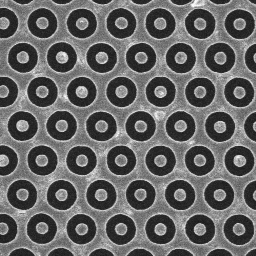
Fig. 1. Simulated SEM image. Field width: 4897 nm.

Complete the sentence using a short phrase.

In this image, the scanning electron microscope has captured a regular array of ring-shaped grooves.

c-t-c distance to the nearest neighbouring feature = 39.1 pixels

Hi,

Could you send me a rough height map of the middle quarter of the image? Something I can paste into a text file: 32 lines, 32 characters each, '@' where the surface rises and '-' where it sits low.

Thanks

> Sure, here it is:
---@@@-------@@@------@@@@------
--@@@@@-----@@@@@----@@@@@@-----
@@@@@@@@@@@@@@@@@@@@@@@@@@@@@@@@
@@@---@@@@@@@---@@@@@@----@@@@@@
@@-----@@@@------@@@@------@@@@-
@-------@@@---@---@@@-------@@@-
@--@@@--@@---@@@--@@---@@@--@@--
@--@@@--@@---@@@--@@@--@@@--@@--
@-------@@@-------@@@-------@@@-
@@-----@@@@------@@@@------@@@@-
@@@@--@@@@@@@---@@@@@@@---@@@@@@
@@@@@@@@@@@@@@@@@@@@@@@@@@@@@@@@
--@@@@@-----@@@@@----@@@@@@----@
---@@@-------@@@------@@@@------
---@@@---@---@@---@@---@@@--@@--
@--@@---@@@--@@---@@---@@---@@@-
---@@@--@@---@@---@@---@@---@@--
---@@@-------@@@------@@@@------
--@@@@@-----@@@@@-----@@@@@-----
@@@@@@@@@@@@@@@@@@@-@@@@@@@@@@@@
@@@---@@@@@@@@-@@@@@@@@--@@@@@@@
@------@@@@------@@@@------@@@@-
@-------@@@-------@@@-------@@--
@--@@@--@@@--@@@--@@---@@---@@--
---@@@--@@@--@@@--@@---@@---@@--
@---@---@@@---@---@@@--@@---@@--
@@-----@@@@------@@@@------@@@@-
@@@---@@@@@@@---@@@@@@----@@@@@@
@@@@@@@@@@@@@@@@@@@@@@@@@@@@@@@@
-@@@@@@----@@@@@@----@@@@@@----@
--@@@@------@@@@------@@@@------
---@@@--@@---@@@---@---@@---@@--